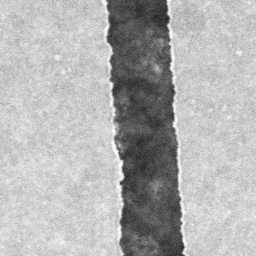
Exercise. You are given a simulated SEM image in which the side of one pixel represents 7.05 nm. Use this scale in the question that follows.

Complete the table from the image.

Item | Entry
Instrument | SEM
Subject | one or a few lines or trenches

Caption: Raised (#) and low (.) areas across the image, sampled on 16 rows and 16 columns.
#######....#####
#######....#####
#######....#####
#######....#####
#######....#####
#######....#####
#######....#####
#######....#####
#######....#####
#######....#####
########...#####
#######....#####
########...#####
#######....#####
#######....#####
########....####